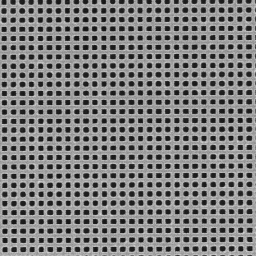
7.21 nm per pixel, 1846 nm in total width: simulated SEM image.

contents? a regular array of holes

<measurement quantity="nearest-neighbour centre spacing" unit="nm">61.9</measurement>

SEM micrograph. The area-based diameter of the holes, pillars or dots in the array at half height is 42.3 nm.